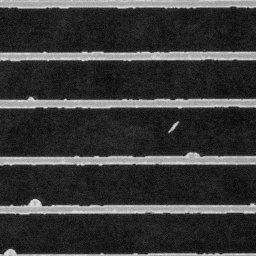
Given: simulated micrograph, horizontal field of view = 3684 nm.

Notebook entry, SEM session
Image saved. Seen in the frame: lines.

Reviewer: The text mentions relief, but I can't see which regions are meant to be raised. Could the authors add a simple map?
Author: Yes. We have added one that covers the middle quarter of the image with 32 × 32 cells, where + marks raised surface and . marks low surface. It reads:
................................
................................
................................
................................
................................
................................
................................
................................
................................
++++++++++++++++++++++++++++++++
++++++++++++++++++++++++++++++++
................................
................................
................................
................................
................................
................................
................................
................................
................................
................................
................................
...............................+
++++++++++++++++++++++++++++++++
++++++++++++++++++++++++++++++++
................................
................................
................................
................................
................................
................................
................................